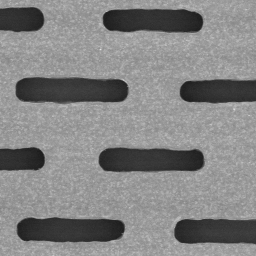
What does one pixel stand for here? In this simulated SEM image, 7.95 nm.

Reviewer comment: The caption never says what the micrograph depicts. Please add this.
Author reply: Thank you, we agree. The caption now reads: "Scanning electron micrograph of holes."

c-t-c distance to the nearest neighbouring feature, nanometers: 844